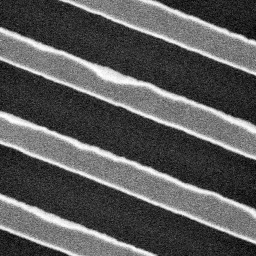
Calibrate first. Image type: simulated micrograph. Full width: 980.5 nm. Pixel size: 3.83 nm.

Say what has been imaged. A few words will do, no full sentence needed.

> lines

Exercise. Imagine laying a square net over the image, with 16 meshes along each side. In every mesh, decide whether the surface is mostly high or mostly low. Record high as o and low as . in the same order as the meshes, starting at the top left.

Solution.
.....oooooo.....
........ooooo...
oo........oooooo
ooooo........ooo
..ooooo........o
.....ooooo......
.......ooooo....
o.........ooooo.
oooo........oooo
.oooooo........o
....ooooo.......
......ooooo.....
o........ooooo..
ooo........ooooo
.ooooo........oo
...oooooo.......